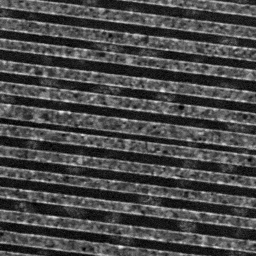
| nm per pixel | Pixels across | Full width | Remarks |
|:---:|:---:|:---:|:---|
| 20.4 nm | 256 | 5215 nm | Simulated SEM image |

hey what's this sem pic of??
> parallel lines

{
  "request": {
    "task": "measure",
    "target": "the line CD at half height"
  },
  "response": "0.22 um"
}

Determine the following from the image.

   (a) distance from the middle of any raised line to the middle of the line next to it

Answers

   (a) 21.2 px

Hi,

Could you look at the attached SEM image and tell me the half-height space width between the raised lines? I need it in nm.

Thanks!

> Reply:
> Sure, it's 220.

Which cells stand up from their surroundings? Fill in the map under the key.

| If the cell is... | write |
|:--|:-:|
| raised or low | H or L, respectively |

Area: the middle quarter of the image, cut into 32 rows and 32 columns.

LLLLLLLLLLLLLLLLLLLLHHHHHHHHHHHH
HLLLLLLLLLLLLLLLLLLLLLLLLLLHHHHH
HHHHHHHHHHLLLLLLLLLLLLLLLLLLLLLL
HHHHHHHHHHHHHHHHHLLLLLLLLLLLLLLL
LLLLLLHHHHHHHHHHHHHHHHHHHLHLLLLL
LLLLLLLLLLLLLLHHHHHHHHHHHHHHHHHH
LLLLLLLLLLLLLLLLLLLLLLHHHHHHHHHH
HHHHHHHLLLLLLLLLLLLLLLLLLLLLLLHH
HHHHHHHHHHHHHHHLLLLLLLLLLLLLLLLL
LLLHHHHHHHHHHHHHHHHHHHHLHLLLLLLL
LLLLLLLLLLLHHHHHHHHHHHHHHHHHHHHL
LLLLLLLLLLLLLLLLLLLHHHHHHHHHHHHH
HHHLLLLLLLLLLLLLLLLLLLLLLLLHHHHH
HHHHHHHHHHHHLLLLLLLLLLLLLLLLLLLL
HHHHHHHHHHHHHHHHHHHHLLLLLLLLLLLL
LLHHHHHHHHHHHHHHHHHHHHHHHHHHLLLL
LLLLLLLLLLHHHHHHHHHHHHHHHHHHHHHH
HHHHLLLLLLLLLLLLLLHHHHHHHHHHHHHH
HHHHHHHHHHHLLLLLLLLLLLLLLLHHHHHH
HHHHHHHHHHHHHHHHHHHLLLLLLLLLLLLL
LLLLLLHHHHHHHHHHHHHHHHHHHHHLLLLL
LLLLLLLLLLLLLLHHHHHHHHHHHHHHHHHH
LLLLLLLLLLLLLLLLLLLLLLHHHHHHHHHH
HHHHHHHLLLLLLLLLLLLLLLLLLLLLLLHH
HHHHHHHHHHHHHHHLLLLLLLLLLLLLLLLL
LLLLLHHHHHHHHHHHHHHHHHHLLLLLLLLL
LLLLLLLLLLLLHHHHHHHHHHHHHHHHHHHL
LLLLLLLLLLLLLLLLLLLLLLHHHHHHHHHH
HHHHHHLLLLLLLLLLLLLLLLLLLLLLHHHH
HHHHHHHHHHHHHHLLLLLLLLLLLLLLLLLL
LLLHHHHHHHHHHHHHHHHHHHLLLLLLLLLL
LLLLLLLLLLLHHHHHHHHHHHHHHHHHHHLL